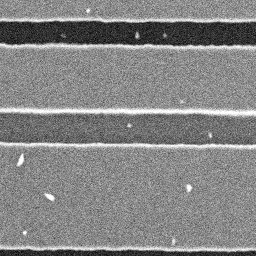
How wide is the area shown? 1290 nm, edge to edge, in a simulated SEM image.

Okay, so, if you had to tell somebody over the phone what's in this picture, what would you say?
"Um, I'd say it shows lines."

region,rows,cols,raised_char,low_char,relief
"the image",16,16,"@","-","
@@@@@@@@@@@@@@@@
----------------
----------------
@@@@@@@@@@@@@@@@
@@@@@@@@@@@@@@@@
@@@@@@@@@@@@@@@@
@@@@@@@@@@@@@@@@
@@@@@@@@@@@@@@@@
@@@@@@@@@@@@@@@@
@@@@@@@@@@@@@@@@
@@@@@@@@@@@@@@@@
@@@@@@@@@@@@@@@@
@@@@@@@@@@@@@@@@
@@@@@@@@@@@@@@@@
@@@@@@@@@@@@@@@@
@@@@@@@@@@@@@@@@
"